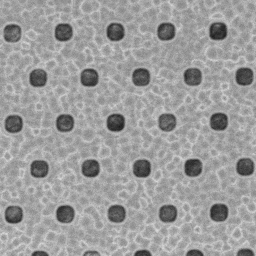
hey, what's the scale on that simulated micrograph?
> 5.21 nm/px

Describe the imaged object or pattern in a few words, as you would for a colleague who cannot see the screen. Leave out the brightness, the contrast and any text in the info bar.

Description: a regular array of holes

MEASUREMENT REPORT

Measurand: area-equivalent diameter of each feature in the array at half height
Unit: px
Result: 19.6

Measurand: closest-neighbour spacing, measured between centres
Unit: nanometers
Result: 267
